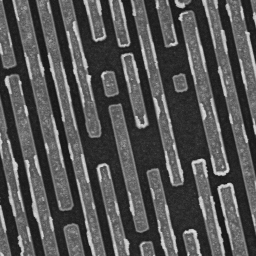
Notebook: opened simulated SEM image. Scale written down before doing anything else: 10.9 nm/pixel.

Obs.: parallel lines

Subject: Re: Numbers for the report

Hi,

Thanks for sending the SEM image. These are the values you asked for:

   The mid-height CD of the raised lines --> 147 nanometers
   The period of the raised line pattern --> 254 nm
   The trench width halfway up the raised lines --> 108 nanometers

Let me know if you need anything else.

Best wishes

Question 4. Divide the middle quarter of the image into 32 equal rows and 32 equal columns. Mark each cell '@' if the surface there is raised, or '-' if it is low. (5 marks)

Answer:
--@@@@---------@@@--@@@---------
--@@@@---------@@@---@@@--------
---@@@----@@@--@@@@--@@@--------
@--@@@@--@@@@--@@@@--@@@---@@@--
@--@@@@---@@@---@@@--@@@---@@@--
@---@@@---@@@---@@@---@@----@@@-
@---@@@---@@@---@@@---@@@---@@--
@---@@@---@@@---@@@---@@@-------
@@--@@@----------@@@--@@@-------
@@---@@----------@@@--@@@-------
@@---@@@---@@@---@@@---@@@------
@@---@@@---@@@@--@@@---@@@------
@@@--@@@----@@@---@@@--@@@------
@@@--@@@----@@@---@@@--@@@------
@@@---@@@---@@@---@@@---@@@-----
@@@---@@@---@@@---@@----@@@-----
@@@---@@@----@@@--------@@@-----
-@@@--@@@----@@@--------@@@-----
-@@@---------@@@--------@@@-----
-@@@---------@@@---------@@@----
-@@@---------@@@@--------@@@----
-@@@@--------@@@@--------@@@----
--@@@---------@@@--------@@@----
--@@@---------@@@--------@@@@---
--@@@---------@@@---------@@@---
--@@@----@@---@@@@--------@@@---
---@@@--@@@----@@@----@@--@@@@--
@--@@@---@@----@@@---@@@--@@@@--
@--@@@---@@@---@@@---@@@--@@@@--
@--@@@---@@@---@@@@--@@@---@@@--
@--@@@@--@@@----@@@--@@@@-------
@@--@@@--@@@@---@@@---@@@-------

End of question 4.